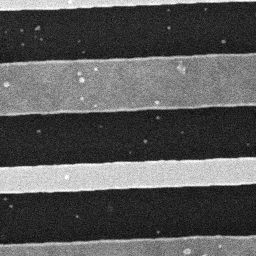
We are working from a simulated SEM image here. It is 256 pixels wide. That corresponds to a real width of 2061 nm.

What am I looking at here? lines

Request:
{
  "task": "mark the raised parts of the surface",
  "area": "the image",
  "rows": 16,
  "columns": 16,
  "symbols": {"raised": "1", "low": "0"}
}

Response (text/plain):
1111100000000000
0000000000000000
0000000000000000
0000000000001111
1111111111111111
1111111111111111
1111111111111111
0000000000000000
0000000000000000
0000000000000000
1111111111111111
1111111111111110
0000000000000000
0000000000000000
0000000000000000
1111111111111111